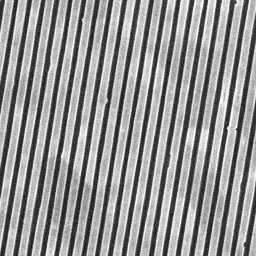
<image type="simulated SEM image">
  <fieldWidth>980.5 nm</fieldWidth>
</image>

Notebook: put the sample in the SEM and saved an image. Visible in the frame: parallel lines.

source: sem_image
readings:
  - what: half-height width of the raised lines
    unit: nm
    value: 29.3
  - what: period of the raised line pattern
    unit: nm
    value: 51.3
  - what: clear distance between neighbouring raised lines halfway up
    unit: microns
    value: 0.0227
